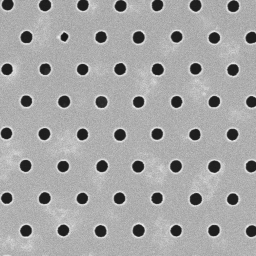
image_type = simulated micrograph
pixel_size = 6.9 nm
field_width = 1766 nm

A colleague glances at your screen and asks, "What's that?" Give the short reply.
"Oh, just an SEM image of a regular array of holes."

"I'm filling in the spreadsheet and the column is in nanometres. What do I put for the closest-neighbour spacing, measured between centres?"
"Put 254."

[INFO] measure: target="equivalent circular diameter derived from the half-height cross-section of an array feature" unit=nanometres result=82.2